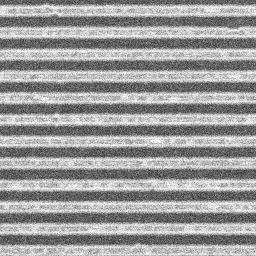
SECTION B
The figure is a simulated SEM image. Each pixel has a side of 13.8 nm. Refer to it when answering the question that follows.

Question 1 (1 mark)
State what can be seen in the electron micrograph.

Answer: parallel lines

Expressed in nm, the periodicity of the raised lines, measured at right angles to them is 302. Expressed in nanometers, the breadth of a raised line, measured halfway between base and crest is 121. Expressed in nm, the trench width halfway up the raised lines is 174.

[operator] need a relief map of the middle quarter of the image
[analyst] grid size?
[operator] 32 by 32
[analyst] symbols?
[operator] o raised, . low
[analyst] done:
................................
................................
oooooooooooooooooooooooooooooooo
oooooooooooooooooooooooooooooooo
................................
................................
................................
ooooooooo....oooooo.oooooooo..oo
oooooooooooooooooooooooooooooooo
oooooooooooooooooooooooooooooooo
................................
................................
................................
oooooooooooooooooooooooooooooooo
oooooooooooooooooooooooooooooooo
................................
................................
................................
ooooooooooooooooooooooooo.oooooo
oooooooooooooooooooooooooooooooo
................................
................................
................................
................................
oooooooooooooooooooooooooooooooo
oooooooooooooooooooooooooooooooo
................................
................................
................................
oooooooooooooooooooooooooooooooo
oooooooooooooooooooooooooooooooo
................................